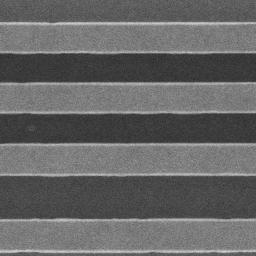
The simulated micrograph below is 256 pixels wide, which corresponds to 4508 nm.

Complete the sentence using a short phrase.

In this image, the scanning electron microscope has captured lines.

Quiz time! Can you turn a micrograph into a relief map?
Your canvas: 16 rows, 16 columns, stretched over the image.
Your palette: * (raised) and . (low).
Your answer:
................
****************
****************
................
................
****************
****************
................
................
****************
****************
................
................
................
****************
****************